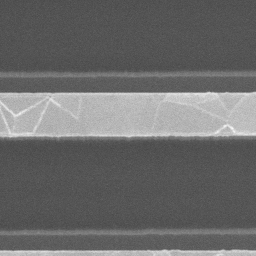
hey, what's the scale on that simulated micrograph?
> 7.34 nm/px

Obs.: lines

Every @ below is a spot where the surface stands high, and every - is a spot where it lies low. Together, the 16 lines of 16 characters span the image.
----------------
----------------
----------------
----------------
----------------
----------------
@@@@@@@@@@@@@@@@
@@@@@@@@@@@@@@@@
@--@---@@-------
----------------
----------------
----------------
----------------
----------------
----------------
----------------